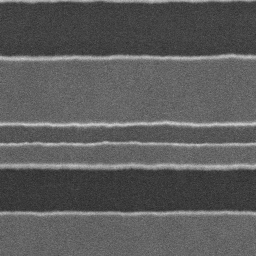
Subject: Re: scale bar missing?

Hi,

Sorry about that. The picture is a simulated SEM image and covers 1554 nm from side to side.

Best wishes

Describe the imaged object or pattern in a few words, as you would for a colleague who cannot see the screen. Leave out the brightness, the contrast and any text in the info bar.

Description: lines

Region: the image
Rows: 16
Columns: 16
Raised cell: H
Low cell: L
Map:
LLLLLLLLLLLLLLLL
LLLLLLLLLLLLLLLL
LLLLLLLLLLLLLLLL
LLLLLLLLLLLLLLLL
HHHHHHHHHHHHHHHH
HHHHHHHHHHHHHHHH
HHHHHHHHHHHHHHHH
HHHHHHHHHHHHHHHH
HHHHHHHHHHHHHHHH
HHHHHHHHHHHHHHHH
LLLLLLLLLLLLLLLL
LLLLLLLLLLLLLLLL
LLLLLLLLLLLLLLLL
HHHHHHHHHHHHHHHH
HHHHHHHHHHHHHHHH
HHHHHHHHHHHHHHHH